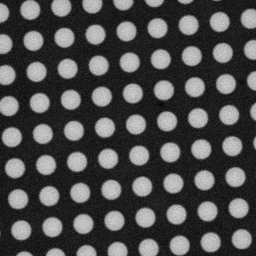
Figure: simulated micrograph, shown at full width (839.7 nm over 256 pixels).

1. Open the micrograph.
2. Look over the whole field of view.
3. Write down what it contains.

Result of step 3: an array of small figures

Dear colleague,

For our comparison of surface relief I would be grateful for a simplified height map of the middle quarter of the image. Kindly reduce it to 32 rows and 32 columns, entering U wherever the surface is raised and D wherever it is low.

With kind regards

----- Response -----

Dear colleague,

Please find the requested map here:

UUUDDDUUUUUDDDUUUUUDDDUUUUDDDDDD
UUUDDDDUUUUDDDDUUUDDDDDDDDDDDDDD
UUUDDDDUUUDDDDDDDDDDDDDDDDDDDDDD
UUDDDDDDDDDDDDDDDDDDDDDDDDDDDDDD
DDDDDDDDDDDDDDDDDDDDDDDDUUDDDDDU
DDDDDDDDDDDDDDDDUUUDDDDUUUUDDDUU
DDDDDDDDUUUDDDDUUUUDDDDUUUUDDDUU
UUUUDDDUUUUUDDDUUUUUDDDUUUUDDDDU
UUUUDDDUUUUUDDDUUUUDDDDUUUUDDDDD
UUUUDDDUUUUUDDDDUUUDDDDDDDDDDDDD
UUUUDDDDDUDDDDDDDDDDDDDDDDDDDDDD
DDDDDDDDDDDDDDDDDDDDDDDDDDDDDDDD
DDDDDDDDDDDDDDDDDDDDDDDDUUUDDDDU
DDDDDDDDDDUDDDDDUUUUDDDDUUUUDDDU
DDUDDDDDUUUUDDDDUUUUDDDUUUUUDDDU
UUUUUDDDUUUUUDDDUUUUDDDDUUUUDDDD
UUUUUDDDUUUUUDDDUUUUDDDDDUUDDDDD
UUUUUDDDUUUUDDDDDDDDDDDDDDDDDDDD
DUUUDDDDDDDDDDDDDDDDDDDDDDDDDDDD
DDDDDDDDDDDDDDDDDDDDDDDDDDDDDDDD
DDDDDDDDDDDDDDDDDDDDDDDDDUUUDDDD
DDDDDDDDDDUUDDDDDUUUUDDDUUUUUDDD
DDUUUDDDDUUUUDDDUUUUUDDDUUUUUDDD
DUUUUUDDDUUUUDDDUUUUUDDDDUUUUDDD
DUUUUUDDDUUUUDDDDUUUUDDDDDUDDDDD
DUUUUDDDDUUUUDDDDDDDDDDDDDDDDDDD
DDUUUDDDDDDDDDDDDDDDDDDDDDDDDDDD
DDDDDDDDDDDDDDDDDDDDDDDDDDUUDDDD
DDDDDDDDDDDDDDDDDDUUUDDDDUUUUDDD
DDDDDDDDDDUUUDDDDUUUUUDDDUUUUUDD
DDUUUUDDDDUUUUDDDUUUUUDDDUUUUUDD
DDUUUUDDDUUUUUDDDUUUUUDDDDUUUDDD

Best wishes